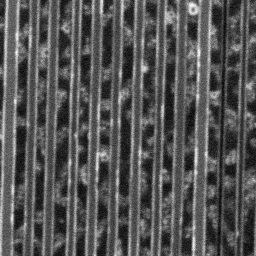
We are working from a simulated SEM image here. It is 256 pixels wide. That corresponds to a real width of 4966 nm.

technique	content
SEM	parallel lines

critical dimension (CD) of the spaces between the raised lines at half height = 150 nm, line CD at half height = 0.252 micrometres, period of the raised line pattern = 408 nm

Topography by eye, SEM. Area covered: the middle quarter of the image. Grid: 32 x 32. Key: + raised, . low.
++..+++..+++..++++..+++..+++..++
++..+++..+++..+++...+++..+++..++
++..+++..+++..+++...+++..+++..++
++..+++..+++..+++...+++..+++..++
++..+++..+++..+++...+++..+++..++
++..+++..+++..+++...+++..+++..++
++..+++..+++..+++...+++..+++..++
++..+++..+++..+++..++++..+++..++
++..+++..+++..+++..++++..+++..++
++..++...+++..+++..++++..+++..++
++..++...+++..+++..++++..+++..++
++.+++...+++..+++..++++..+++..++
++.+++...+++..+++..++++..+++..++
++.+++...+++..+++..++++..+++..++
++.+++...+++..+++..++++..+++..++
+...++...+++..+++..++++..+++..++
+...++...+++..+++..++++..+++..++
+..+++...+++..+++..++++..+++..++
++.+++...+++..+++..++++..+++..++
+..+++...+++..+++..++++..+++..++
+..+++...+++..+++..++++..+++..++
+..+++...+++..+++..++++..+++..++
+..+++...+++..+++..++++.+++...++
+..+++..+++...+++..+++..+++...++
+..+++..+++...+++..+++..+++...++
+..+++..+++...+++..+++..+++...++
+..+++..+++...+++..+++..+++...++
+..+++..+++...+++..+++..+++...++
+..+++..+++...+++..+++..+++...++
+..+++..+++...+++..+++..+++...++
+..+++..+++..+++...+++..+++...++
+..+++..+++..+++...+++..+++...++